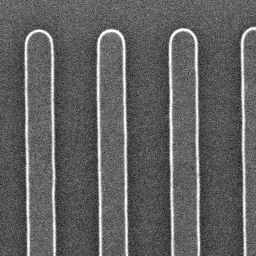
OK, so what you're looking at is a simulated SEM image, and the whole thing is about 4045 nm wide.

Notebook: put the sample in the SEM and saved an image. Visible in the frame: groups of lines, slits or small figures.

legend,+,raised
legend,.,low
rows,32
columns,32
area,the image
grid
................................
................................
................................
................................
....++.......++.......++......++
...++++.....++++.....++++.....++
...++++.....++++.....++++.....++
...++++.....++++.....++++.....++
...++++.....++++.....++++.....++
...++++.....++++.....++++.....++
...++++.....++++.....++++.....++
...++++.....++++.....++++.....++
...++++.....++++.....++++.....++
...++++.....++++.....++++.....++
...++++.....++++.....++++.....++
...++++.....++++.....++++.....++
...++++.....++++.....++++.....++
...++++.....++++.....++++.....++
...++++.....++++.....++++.....++
...++++.....++++.....++++.....++
...++++.....++++.....++++......+
...++++.....++++.....++++......+
...++++.....++++.....++++......+
...++++.....++++.....++++......+
...++++......+++.....++++......+
...++++......+++......+++......+
...++++......+++......+++......+
....+++......+++......+++......+
....+++......+++......+++......+
....+++......+++......+++......+
....+++......+++......+++......+
....+++......+++......+++......+